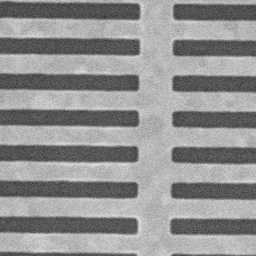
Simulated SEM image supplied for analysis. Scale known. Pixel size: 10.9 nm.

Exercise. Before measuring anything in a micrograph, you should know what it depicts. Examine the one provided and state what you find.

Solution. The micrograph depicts groups of lines, slits or small figures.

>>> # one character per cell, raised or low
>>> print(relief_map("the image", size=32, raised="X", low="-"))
-----------------XXXXX----------
------------------XXX-----------
XXXXXXXXXXXX-----XXXXX----------
XXXXXXXXXXXXXXXXXXXXXXXXXXXXXXXX
----XXXXXXXXXXXXXXXXXXXXXXXXXXXX
------------------XXX-----------
------------------XXX-----------
XXXXXXXXXXXXXXXXXXXXXXXXXXXXXXXX
XXXXXXXXXXXXXXXXXXXXXXXXXXXXXXXX
-----------------XXXXX----------
------------------XXX-----------
XXXXXXXXXXXXXXXX-XXXXX----------
XXXXXXXXXXXXXXXXXXXXXXXXXXXXXXXX
XXXXXXXXXXXXXXXXXXXXXXXXXXXXXXXX
------------------XXX-----------
-----------------XXXX-----------
XXXXXXXXXXXXXXXXXXXXXXXXXXXXXXXX
XXXXXXXXXXXXXXXXXXXXXXXXXXXXXXXX
-----------------XXXXX----------
-----------------XXXX-----------
XXXXXXX---------XXXXXX----------
XXXXXXXXXXXXXXXXXXXXXXXXXXXXXXXX
XXXXXX-----XXXXXXXXXXXXXXXXXXXXX
-----------------XXXX-----------
-----------------XXXX-----------
XXXXXXXXXXXXXXXXXXXXXXXXXXXXXXXX
XXXXXXXXXXXXXXXXXXXXXXXXXXXXXXXX
-----------------XXXX-----------
-----------------XXXX-----------
XXXXXXXXXXXXXXX--XXXXX----------
XXXXXXXXXXXXXXXXXXXXXXXXXXXXXXXX
--------XXXXXXXX-XXXXXXXXXXXXXXX